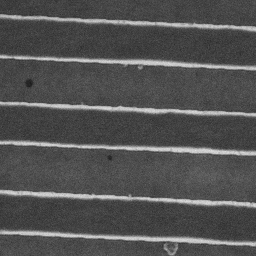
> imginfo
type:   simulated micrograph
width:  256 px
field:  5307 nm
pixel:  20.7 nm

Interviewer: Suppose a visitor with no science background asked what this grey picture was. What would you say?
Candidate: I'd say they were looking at lines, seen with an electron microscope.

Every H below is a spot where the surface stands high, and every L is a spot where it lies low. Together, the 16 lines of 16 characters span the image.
LLLLLLLLLLLLLLLL
HHHHHHHHHHHLLLLL
HHHHHHHHHHHHHHHH
HHHHHHHHHHHHHHHH
LLLLLLLLLLLLLLLL
LLLLLLLLLLLLLLLL
HHLLLLLLLLLLLLLL
HHHHHHHHHHHHHHHH
HHHHHHHHHHHHHHHH
LLLLLLLLLLLLLHHH
LLLLLLLLLLLLLLLL
LLLLLLLLLLLLLLLL
HHHHHHHHHHHLLLLL
HHHHHHHHHHHHHHHH
HHHHHHHHHHHHHHHH
LLLLLLLLLLLLLLLL